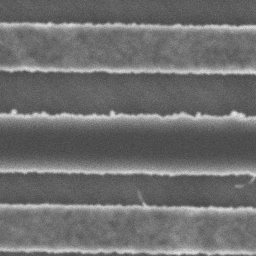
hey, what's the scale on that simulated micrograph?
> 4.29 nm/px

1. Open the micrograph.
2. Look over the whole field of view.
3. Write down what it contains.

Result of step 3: lines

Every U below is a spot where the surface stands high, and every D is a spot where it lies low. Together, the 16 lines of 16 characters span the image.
DDDDDDDDDDDDDDDD
UUDDDDDDDDDDDDDD
UUUUUUUUUUUUUUUU
UUUUUUUUUUUUUUUU
DDDDDDDUUUUUUUUU
DDDDDDDDDDDDDDDD
DDDDDDDDDDDDDDDD
UUUUUUUUUUUUUUUU
UUUUUUUUUUUUUUUU
UUUUUUUUUUUUUUUU
UUUUUUUUUUUUUUUU
DDDDDDDDDDDDDDDD
DDDDDDDDDDDDDDDD
UUUUUUUUUUUUUUUU
UUUUUUUUUUUUUUUU
UUUUUUUUUUUUUUUU